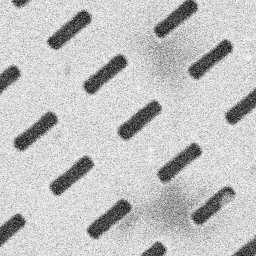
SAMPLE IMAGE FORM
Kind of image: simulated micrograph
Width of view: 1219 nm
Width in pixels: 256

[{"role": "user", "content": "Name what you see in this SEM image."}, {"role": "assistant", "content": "a regular array of holes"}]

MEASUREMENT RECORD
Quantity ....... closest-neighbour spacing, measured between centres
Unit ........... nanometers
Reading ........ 272